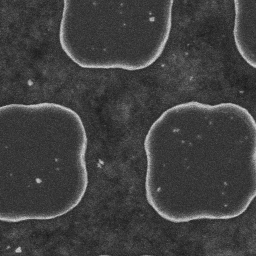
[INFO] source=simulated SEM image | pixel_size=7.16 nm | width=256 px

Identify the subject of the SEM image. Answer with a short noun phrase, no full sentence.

raised bodies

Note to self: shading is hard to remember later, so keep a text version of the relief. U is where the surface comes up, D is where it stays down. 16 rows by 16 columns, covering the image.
DDDDUUUUUUUDDDDU
DDDDUUUUUUUDDDDU
DDDDUUUUUUDDDDDU
DDDDUUUUUUDDDDDU
DDDDDDDDDDDDDDDD
DDDDDDDDDDDDDDDD
DDDDDDDDDDDDDDDD
UUUUUDDDDDUUUUUU
UUUUUDDDDUUUUUUU
UUUUUDDDDUUUUUUU
UUUUUDDDDUUUUUUU
UUUUUDDDDUUUUUUU
UUUUUDDDDUUUUUUU
UUUUDDDDDDUUUUUD
DDDDDDDDDDDDDDDD
DDDDDDDDDDDDDDDD